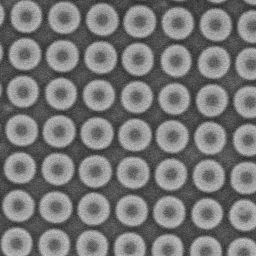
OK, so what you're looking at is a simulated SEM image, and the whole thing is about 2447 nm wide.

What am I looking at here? an array of small figures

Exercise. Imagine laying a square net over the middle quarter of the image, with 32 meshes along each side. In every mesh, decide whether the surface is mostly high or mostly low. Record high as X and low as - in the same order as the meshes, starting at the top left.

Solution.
XXX---XXXXXXX--XXXXXXX--XXXXXXXX
X------XXXXX----XXXXX----XXXXXX-
-----------------XXX------XXXX--
--------------------------------
XX-----XXXX---------------------
XX----XXXXXX----XXXXX-----XXX---
XXX--XXXXXXX---XXXXXXX--XXXXXXX-
XXX--XXXXXXX---XXXXXXX--XXXXXXX-
XXX--XXXXXXX--XXXXXXXX--XXXXXXX-
XX---XXXXXXX---XXXXXXX--XXXXXXX-
XX----XXXXX----XXXXXX---XXXXXXX-
--------XX------XXXX-----XXXXX--
--------------------------------
X-------------------------------
XX----XXXXX-----XXXX------XXX---
XX---XXXXXXX---XXXXXX---XXXXXX--
XXX-XXXXXXXX--XXXXXXXX-XXXXXXXX-
XXX-XXXXXXXX--XXXXXXXX-XXXXXXXX-
XX--XXXXXXXX--XXXXXXXX-XXXXXXXX-
XX---XXXXXXX--XXXXXXX--XXXXXXXX-
------XXXXX----XXXXXX---XXXXXX--
----------------XXX------XXXX---
--------------------------------
X-----XXXX------XX--------------
XX---XXXXXX---XXXXXX-----XXXX---
XX--XXXXXXXX--XXXXXXX---XXXXXX--
XX--XXXXXXXX-XXXXXXXX--XXXXXXX--
XX--XXXXXXXX-XXXXXXXX--XXXXXXX--
XX--XXXXXXX---XXXXXXX--XXXXXXX--
X----XXXXXX---XXXXXX---XXXXXXX--
------XXX-------XXX-----XXXXX---
--------------------------------